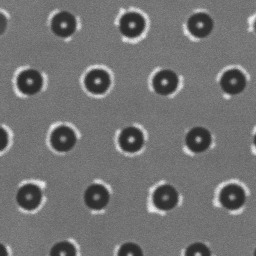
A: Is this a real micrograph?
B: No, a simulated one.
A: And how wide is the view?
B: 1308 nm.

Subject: a regular array of ring-shaped grooves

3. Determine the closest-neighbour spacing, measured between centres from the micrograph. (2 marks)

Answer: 66.4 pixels